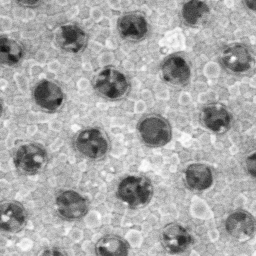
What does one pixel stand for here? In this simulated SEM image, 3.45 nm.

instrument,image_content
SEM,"a regular array of raised bodies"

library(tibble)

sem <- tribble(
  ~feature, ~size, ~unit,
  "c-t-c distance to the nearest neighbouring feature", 0.212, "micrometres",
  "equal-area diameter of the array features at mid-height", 107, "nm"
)